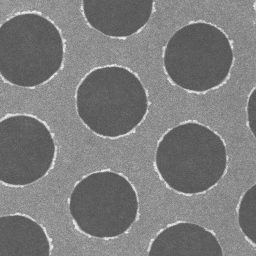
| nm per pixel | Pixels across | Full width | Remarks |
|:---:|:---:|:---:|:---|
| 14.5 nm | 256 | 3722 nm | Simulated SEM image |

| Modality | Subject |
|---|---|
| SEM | holes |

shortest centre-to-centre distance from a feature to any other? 1.42 micrometres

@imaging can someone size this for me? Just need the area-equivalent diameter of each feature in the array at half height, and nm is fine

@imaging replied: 1010